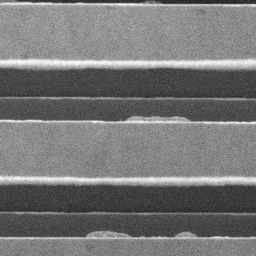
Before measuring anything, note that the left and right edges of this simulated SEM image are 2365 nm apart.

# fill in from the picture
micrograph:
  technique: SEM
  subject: lines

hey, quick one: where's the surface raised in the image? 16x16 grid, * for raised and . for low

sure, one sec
****************
****************
****************
****************
................
................
................
................
****************
****************
****************
................
................
................
................
****************